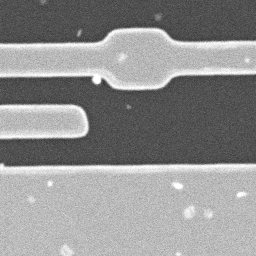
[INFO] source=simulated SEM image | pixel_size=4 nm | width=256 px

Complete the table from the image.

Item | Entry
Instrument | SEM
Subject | wiring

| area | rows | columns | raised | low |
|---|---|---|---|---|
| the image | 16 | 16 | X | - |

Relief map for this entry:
----------------
----------------
------XXXXX-----
XXXXXXXXXXXXXXXX
XXXXXXXXXXXXXXXX
-------XXX------
----------------
XXXXX-----------
XXXXX-----------
----------------
-XXXXXXXXXXXXXXX
XXXXXXXXXXXXXXXX
XXXXXXXXXXXXXXXX
XXXXXXXXXXXXXXXX
XXXXXXXXXXXXXXXX
XXXXXXXXXXXXXXXX